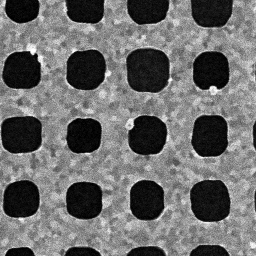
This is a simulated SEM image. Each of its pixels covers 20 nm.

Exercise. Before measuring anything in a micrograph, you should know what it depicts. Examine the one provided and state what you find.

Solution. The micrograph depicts a regular array of holes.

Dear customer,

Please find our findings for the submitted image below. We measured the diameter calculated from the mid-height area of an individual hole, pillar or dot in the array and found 0.81 microns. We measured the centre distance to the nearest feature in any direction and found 1250 nm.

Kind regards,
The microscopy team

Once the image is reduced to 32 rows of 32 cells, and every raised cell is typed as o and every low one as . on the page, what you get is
o....ooo.....ooo.....ooo.....ooo
o....ooo.....ooo.....ooo.....ooo
o...ooooo....oooo...oooo.....ooo
oooooooooooooooooooooooooooooooo
oooooooooooooooooooooooooooooooo
oooooooooooooooooooooooooooooooo
oo..ooooo...ooooo...oooooo.ooooo
o....ooo.....ooo.....ooo....oooo
.....ooo.....ooo.....ooo.....ooo
.....ooo.....ooo.....ooo.....ooo
o....oooo....ooo.....ooo....oooo
ooooooooooooooooooo.oooooooooooo
oooooooooooooooooooooooooooooooo
oooooooooooooooooooooooooooooooo
ooo.oooooooooooooo.ooooooo.ooooo
.....oooo...ooooo....ooo....oooo
.....ooo.....ooo.....ooo....oooo
.....ooo.....ooo.....ooo....oooo
o....oooo...oooo....oooo....oooo
ooooooooooooooooooooooooo..ooooo
oooooooooooooooooooooooooooooooo
oooooooooooooooooooooooooooooooo
oooooooooooooooooo.ooooooo.ooooo
o....oooo....ooo....oooo....oooo
.....ooo.....ooo.....ooo.....ooo
.....ooo.....ooo.....ooo.....ooo
o....oooo....ooo....oooo.....ooo
oooooooooooooooooo.oooooo...oooo
oooooooooooooooooooooooooooooooo
oooooooooooooooooooooooooooooooo
oooooooooooooooooooooooooooooooo
o...oooo....oooo....oooo....oooo